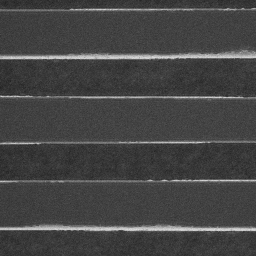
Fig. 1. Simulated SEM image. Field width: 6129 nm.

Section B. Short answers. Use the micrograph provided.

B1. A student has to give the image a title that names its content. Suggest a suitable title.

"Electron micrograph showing lines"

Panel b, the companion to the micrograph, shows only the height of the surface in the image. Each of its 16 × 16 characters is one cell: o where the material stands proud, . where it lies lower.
................
oooooooooooooooo
oooooooooooooooo
oooooooooooooooo
................
................
oooooooooooooooo
oooooooooooooooo
oooooooooooooooo
................
................
oooooooooooooooo
oooooooooooooooo
oooooooooooooooo
................
................